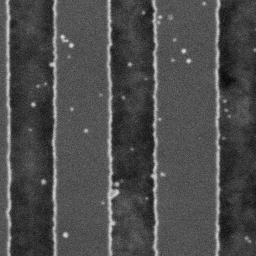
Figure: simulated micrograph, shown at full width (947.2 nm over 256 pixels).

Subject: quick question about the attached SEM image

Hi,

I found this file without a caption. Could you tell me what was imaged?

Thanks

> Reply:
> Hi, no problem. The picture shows lines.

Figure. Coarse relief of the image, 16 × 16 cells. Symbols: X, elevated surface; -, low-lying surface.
X--XXXX---XXXX--
X--XXXX---XXXX--
X--XXXX---XXXX--
X--XXXX---XXXX--
X--XXXX---XXXX--
X--XXXX---XXXX--
X--XXXX---XXXX--
X--XXXX---XXXX--
X--XXXX---XXXX--
X--XXXX---XXXX--
X--XXXX---XXXX--
X--XXXX---XXXX--
X--XXXX---XXXX--
X--XXXX---XXXX--
X--XXXX---XXXX--
X--XXXX---XXXX--